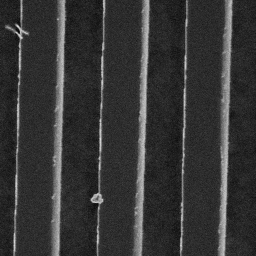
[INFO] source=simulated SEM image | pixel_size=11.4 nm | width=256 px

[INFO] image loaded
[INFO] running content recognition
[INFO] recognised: lines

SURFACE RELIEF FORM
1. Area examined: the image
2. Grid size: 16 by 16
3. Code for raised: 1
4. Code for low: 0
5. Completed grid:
0111001110001100
0111001110001100
0111001110001100
0111001110001100
0111001110001100
0111001110001100
0111001110001100
0111001110001100
0111001110011100
0111001110011100
0111001110011100
0111001110011100
0111001110011100
0111001110011100
0111001110011100
0111001110011100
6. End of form